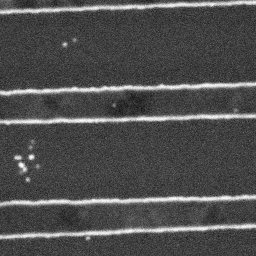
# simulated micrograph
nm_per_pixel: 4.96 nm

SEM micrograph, lines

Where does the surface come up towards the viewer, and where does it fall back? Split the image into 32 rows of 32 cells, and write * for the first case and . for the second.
*****************************...
**..............................
................................
................................
................................
................................
................................
................................
................................
................................
.............................***
.*******************************
********************************
********************************
********************************
................................
................................
................................
................................
................................
................................
................................
................................
................................
................................
********************************
********************************
********************************
****************************....
****.*..........................
................................
................................